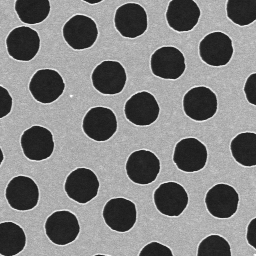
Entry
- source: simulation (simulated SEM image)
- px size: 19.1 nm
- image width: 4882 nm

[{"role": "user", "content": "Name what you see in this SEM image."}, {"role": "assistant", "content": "a regular array of holes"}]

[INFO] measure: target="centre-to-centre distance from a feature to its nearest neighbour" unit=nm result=922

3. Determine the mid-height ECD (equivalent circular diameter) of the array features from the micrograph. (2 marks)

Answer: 652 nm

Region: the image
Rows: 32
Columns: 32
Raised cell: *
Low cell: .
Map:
**....**********.****....***....
**....*********...***....***....
***..****..***....***....****...
**..****....***...****..********
*....***....***..*********..****
*....****...*************....***
*....**************....**....***
**..***************....**....***
************...****....*********
****....****....****..*********.
****....****....***************.
.***....*****..********....****.
.****..*********...****....****.
.***********.***....***....*****
.**********...**....****...*****
**********.....**..*************
***...*****...******************
***....*****.**********..****...
***....***************....***...
***...**********...***....***...
****************....**....****..
*********...****....************
*...****....****...*************
*....***....********...***...***
*....****...*******....***....**
*....********....**....***....**
*******..****....***...***...***
******....***....***************
...***....****..***************.
...***....****************.****.
...****.***********.*****....**.
..****************...****....***